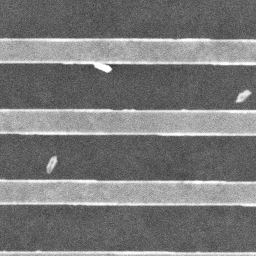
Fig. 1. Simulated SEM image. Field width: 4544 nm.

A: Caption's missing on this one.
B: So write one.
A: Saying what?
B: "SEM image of lines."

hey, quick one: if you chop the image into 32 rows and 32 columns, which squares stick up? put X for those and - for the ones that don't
--------------------------------
--------------------------------
--------------------------------
--------------------------------
--------------------------------
XXXXXXXXXXXXXXXXXXXXXXXXXXXXXXXX
XXXXXXXXXXXXXXXXXXXXXXXXXXXXXXXX
XXXXXXXXXXXXXXXXXXXXXXXXXXXXXXXX
------------XX------------------
--------------------------------
--------------------------------
--------------------------------
--------------------------------
--------------------------------
XXXXXXXXXXXXXXXXXXXXXXXXXXXXXXXX
XXXXXXXXXXXXXXXXXXXXXXXXXXXXXXXX
XXXXXXXXXXXXXXXXXXXXXXXXXXXXXXXX
--------------------------------
--------------------------------
--------------------------------
--------------------------------
--------------------------------
--------------------------------
XXXXXXXXXXXXXXXXXXXXXXXXXXXXXXXX
XXXXXXXXXXXXXXXXXXXXXXXXXXXXXXXX
---------XXXXXXXXXXXXXXXXXXXXXXX
--------------------------------
--------------------------------
--------------------------------
--------------------------------
--------------------------------
----X---------------------------